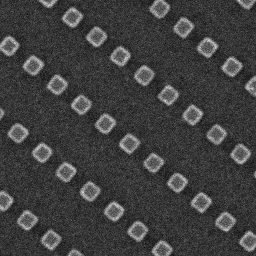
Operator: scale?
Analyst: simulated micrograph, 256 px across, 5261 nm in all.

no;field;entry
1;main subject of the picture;a regular array of raised bodies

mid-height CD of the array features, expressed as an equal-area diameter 0.349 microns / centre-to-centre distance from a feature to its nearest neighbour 0.635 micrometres